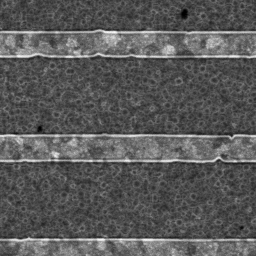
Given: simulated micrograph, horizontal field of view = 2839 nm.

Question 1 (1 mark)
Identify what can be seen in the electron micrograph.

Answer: one or a few lines or trenches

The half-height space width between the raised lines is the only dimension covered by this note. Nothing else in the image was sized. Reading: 878 nm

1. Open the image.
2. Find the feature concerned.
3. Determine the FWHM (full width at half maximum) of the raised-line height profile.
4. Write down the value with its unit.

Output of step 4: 269 nanometers